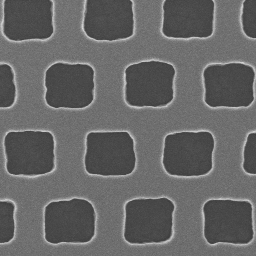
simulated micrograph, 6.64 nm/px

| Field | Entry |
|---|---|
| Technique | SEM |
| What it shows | a regular array of holes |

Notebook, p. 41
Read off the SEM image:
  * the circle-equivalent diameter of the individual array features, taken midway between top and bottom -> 336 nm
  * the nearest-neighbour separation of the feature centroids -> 0.518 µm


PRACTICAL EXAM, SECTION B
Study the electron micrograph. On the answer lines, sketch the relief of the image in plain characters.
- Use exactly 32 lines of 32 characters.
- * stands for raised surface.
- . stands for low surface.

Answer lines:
*.....*****......***.......***..
.......****......***.......***..
.......***.......***.......***..
.......***.......***.......***..
*.....*****.....*****.....*****.
********************************
********************************
********************************
.*****.....*****......****.....*
..****......****......****......
..****......****......****......
..****......****......****......
..****......****.....*****......
*******...**********************
********************************
********************************
*.....******...**********.******
*......****......****......****.
*......****......****......****.
*......****......***.......****.
*......****......***.......***..
*.....*****.....*****.....*****.
********************************
********************************
********************************
.*****.....*****......****.....*
..****......****......***.......
..****......****......****......
..****......****......***.......
..****......****.....*****......
*****************************..*
********************************